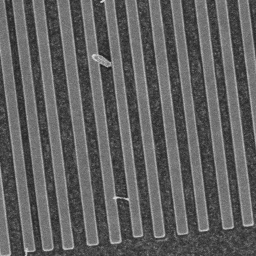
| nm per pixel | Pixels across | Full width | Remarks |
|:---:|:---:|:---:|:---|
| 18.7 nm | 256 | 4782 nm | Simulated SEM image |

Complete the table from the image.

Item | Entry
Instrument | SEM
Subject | parallel lines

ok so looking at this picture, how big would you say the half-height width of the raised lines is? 195 nm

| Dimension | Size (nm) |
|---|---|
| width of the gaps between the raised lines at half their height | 227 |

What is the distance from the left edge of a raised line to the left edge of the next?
410 nanometres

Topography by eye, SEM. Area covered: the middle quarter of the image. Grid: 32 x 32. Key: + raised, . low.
+++...+++.+.++...+++...+++...++.
.++...+++...+++...++...+++...++.
.++....++...+++...++....++...++.
.++....++....++...++....++...++.
.+++...++....++...++....++...+++
.+++...++....++...+++...++...+++
.+++...++....++...+++...+++...++
.+++...+++...++...+++...+++...++
.+++...+++...++...+++...+++...++
..++...+++...+++...++...+++...++
..++....++...+++...++....++...++
..++....++....++...++....++...++
..+++...++....++...++....++...++
..+++...++....++...+++...++...++
..+++...++....++...+++...+++...+
..+++...+++...++...+++...+++...+
..+++...+++...++...+++...+++...+
..+++...+++...+++...++...+++...+
...++....++...+++...++...+++...+
...++....++....++...++...+++...+
...+++...++....++...++....++...+
...+++...++....++...++....++...+
...+++...++....++...+++...+++...
...+++...+++...++...+++...+++...
...+++...+++...++...+++...+++...
...+++...+++...+++...++...+++...
....++...+++...+++...++...+++...
....++....++....++...++...+++...
....+++...++....++...++....++...
....+++...++....++...++....++...
....+++...++....++...+++...++...
+...+++...+++...++...+++...+++..